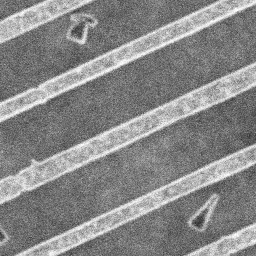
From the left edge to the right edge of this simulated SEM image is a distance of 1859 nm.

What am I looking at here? one or a few lines or trenches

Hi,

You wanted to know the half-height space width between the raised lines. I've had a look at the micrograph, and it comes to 400 nanometers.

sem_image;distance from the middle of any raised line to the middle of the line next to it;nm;525